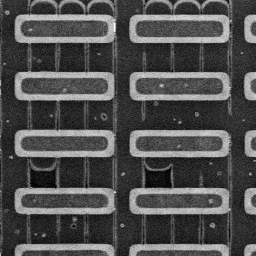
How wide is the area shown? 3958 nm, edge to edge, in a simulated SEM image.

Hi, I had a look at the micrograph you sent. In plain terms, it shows wiring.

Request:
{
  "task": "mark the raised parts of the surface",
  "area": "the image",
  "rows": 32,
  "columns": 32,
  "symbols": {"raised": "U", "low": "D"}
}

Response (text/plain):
DDDDDDDDDDDDDDDDDDDDDDDDDDDDDDDD
DDDDDDDDDDDDDDDDDDDDDDDDDDDDDDDD
DDDUUUUUUUUUUUDDDUUUUUUUUUUUDDDU
DDUUUUUUUUUUUUDDDUUUUUUUUUUUDDDU
DDUUUUUUUUUUUUDDDUUUUUUUUUUUDDDU
DDDDDDDDDDDDDDDDDDDDDDDDDDDDDDDD
DDDDDDDDDDDDDDDDDDDDDDDDDDDDDDDD
DDDDDDDDDDDDDDDDDDDDDDDDDDDDDDDD
DDDDDDDDDDDDDDDDDDDDDDDDDDDDDDDD
DDDUUUUUUUUUUDDDDUUUUUUUUUUUDDDU
DDUUUUUUUUUUUUDDDUUUUUUUUUUUDDDU
DDUUUUUUUUUUUUDDDUUUUUUUUUUUDDDU
DDDDDDDDDDDDDDDDDDDDDDDDDDDDDDDD
DDDDDDDDDDDDDDDDDDDDDDDDDDDDDDDD
DDDDDDDDDDDDDDDDDDDDDDDDDDDDDDDD
DDDDDDDDDDDDDDDDDDDDDDDDDDDDDDDD
DDDDDDDDDDDDDDDDDDDDDDDDDDDDDDDD
DDUUUUUUUUUUUUDDDUUUUUUUUUUUDDDU
DDUUUUUUUUUUUUDDDUUUUUUUUUUUDDDU
DDDDDDDDDDDDDDDDDDDDDDDDDDDDDDDD
DDDDDDDDDDDDDDDDDDDDDDDDDDDDDDDD
DDDDDDDDDDDDDDDDDDDDDDDDDDDDDDDD
DDDDDDDDDDDDDDDDDDDDDDDDDDDDDDDD
DDDDDDDDDDDDDDDDDDDDDDDDDDDDDDDD
DDUUUUUUUUUUUUDDDUUUUUUUUUUUDDDU
DDUUUUUUUUUUUUDDDUUUUUUUUUUUDDDU
DDDDDDDDDDDDDDDDDDDDDDDDDDDDDDDD
DDDDDDDDDDDDDDDDDDDDDDDDDDDDDDDD
DDDDDDDDDDDDDDDDDDDDDDDDDDDDDDDD
DDDDDDDDDDDDDDDDDDDDDDDDDDDDDDDD
DDDDDDDDDDDDDDDDDDDDDDDDDDDDDDDD
DDUUUUUUUUUUUUDDDUUUUUUUUUUUDDDU